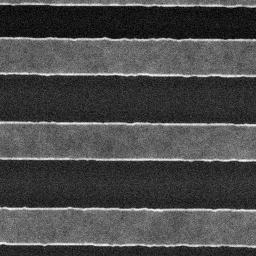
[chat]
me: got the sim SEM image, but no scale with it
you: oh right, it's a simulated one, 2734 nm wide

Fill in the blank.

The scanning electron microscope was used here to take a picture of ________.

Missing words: lines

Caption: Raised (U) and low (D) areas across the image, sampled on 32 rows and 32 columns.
UUUUUUUUUUUUUUUUUUUUUUUUUUUUUUUU
DDDDDDDDDDDDDDDDDDDDDDDDDDDDDDDD
DDDDDDDDDDDDDDDDDDDDDDDDDDDDDDDD
DDDDDDDDDDDDDDDDDDDDDDDDDDDDDDDD
DDDDDDDDDDDDDDDDDDDDDDDDDDDDDDDD
UUUUUUUUUUUUUUUUUUUUUUUUUUUUUUUU
UUUUUUUUUUUUUUUUUUUUUUUUUUUUUUUU
UUUUUUUUUUUUUUUUUUUUUUUUUUUUUUUU
UUUUUUUUUUUUUUUUUUUUUUUUUUUUUUUU
DDDDDDDDDDDDDDDDDDDDDDUUUUDUUUUU
DDDDDDDDDDDDDDDDDDDDDDDDDDDDDDDD
DDDDDDDDDDDDDDDDDDDDDDDDDDDDDDDD
DDDDDDDDDDDDDDDDDDDDDDDDDDDDDDDD
DDDDDDDDDDDDDDDDDDDDDDDDDDDDDDDD
DDDDDDDDDDDDDDDDDDDDDDDDDDDDDDDD
UUUUUUUUUUUUUUUUUUDDDDDDDDDDDDDD
UUUUUUUUUUUUUUUUUUUUUUUUUUUUUUUU
UUUUUUUUUUUUUUUUUUUUUUUUUUUUUUUU
UUUUUUUUUUUUUUUUUUUUUUUUUUUUUUUU
UUUUUUUUUUUUUUUUUUUUUUUUUUUUUUUU
DDDDDDDDDDDDDDDDDDDDDDDDDDDDDDDD
DDDDDDDDDDDDDDDDDDDDDDDDDDDDDDDD
DDDDDDDDDDDDDDDDDDDDDDDDDDDDDDDD
DDDDDDDDDDDDDDDDDDDDDDDDDDDDDDDD
DDDDDDDDDDDDDDDDDDDDDDDDDDDDDDDD
DDDDDDDDDDDDDDDDDDDDDDDDDDDDDDDD
UUUUUUUUUUUUUUUUUUUUUUUUUUUUUUUU
UUUUUUUUUUUUUUUUUUUUUUUUUUUUUUUU
UUUUUUUUUUUUUUUUUUUUUUUUUUUUUUUU
UUUUUUUUUUUUUUUUUUUUUUUUUUUUUUUU
DUUUUUUUUUUUUUUUUUUUUUUUUUUUUUUU
DDDDDDDDDDDDDDDDDDDDDDDDDDDDDDDD